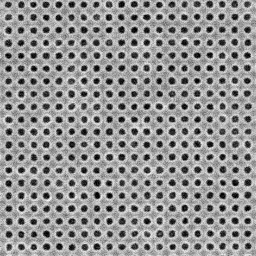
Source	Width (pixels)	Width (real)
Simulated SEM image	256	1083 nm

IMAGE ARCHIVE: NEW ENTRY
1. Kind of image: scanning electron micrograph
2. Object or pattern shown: a regular array of holes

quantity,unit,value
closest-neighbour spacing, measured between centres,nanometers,52.1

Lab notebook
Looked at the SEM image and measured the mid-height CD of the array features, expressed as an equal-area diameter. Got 0.0306 µm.